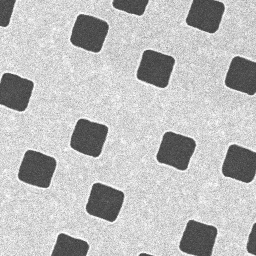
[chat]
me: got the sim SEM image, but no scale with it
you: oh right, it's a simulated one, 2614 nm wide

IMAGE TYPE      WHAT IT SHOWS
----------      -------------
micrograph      holes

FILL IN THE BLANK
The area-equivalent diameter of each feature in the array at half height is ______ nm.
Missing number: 379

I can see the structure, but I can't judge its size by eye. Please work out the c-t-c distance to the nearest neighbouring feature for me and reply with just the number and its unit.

0.726 microns